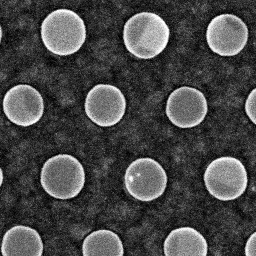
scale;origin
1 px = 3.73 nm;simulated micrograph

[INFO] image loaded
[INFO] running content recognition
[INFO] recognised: a regular array of raised bodies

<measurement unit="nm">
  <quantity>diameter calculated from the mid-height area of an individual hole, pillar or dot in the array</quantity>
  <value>154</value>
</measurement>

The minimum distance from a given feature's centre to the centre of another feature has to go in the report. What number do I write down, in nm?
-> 302